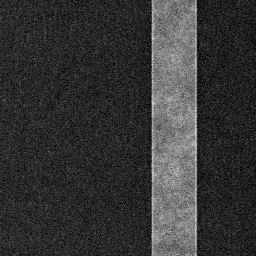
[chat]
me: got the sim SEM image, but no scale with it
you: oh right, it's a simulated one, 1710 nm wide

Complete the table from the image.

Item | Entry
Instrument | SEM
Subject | one or a few lines or trenches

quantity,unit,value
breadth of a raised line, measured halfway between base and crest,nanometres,290